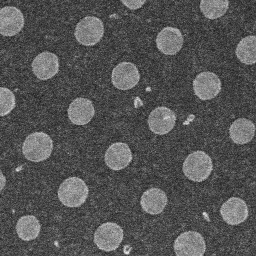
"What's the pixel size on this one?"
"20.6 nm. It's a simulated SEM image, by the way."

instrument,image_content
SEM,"a regular array of raised bodies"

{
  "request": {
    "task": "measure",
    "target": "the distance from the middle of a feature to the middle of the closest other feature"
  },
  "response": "1.16 µm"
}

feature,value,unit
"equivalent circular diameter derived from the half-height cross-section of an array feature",540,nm